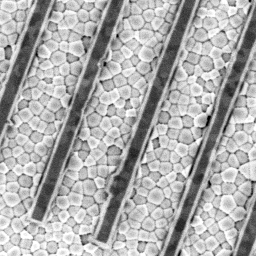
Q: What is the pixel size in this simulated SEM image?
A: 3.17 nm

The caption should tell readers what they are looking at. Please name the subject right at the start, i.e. one or a few lines or trenches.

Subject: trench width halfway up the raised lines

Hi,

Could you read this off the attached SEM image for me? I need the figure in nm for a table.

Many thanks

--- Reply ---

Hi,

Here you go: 169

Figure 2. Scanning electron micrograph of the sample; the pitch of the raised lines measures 217 nm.